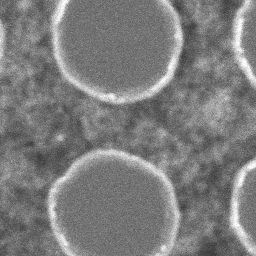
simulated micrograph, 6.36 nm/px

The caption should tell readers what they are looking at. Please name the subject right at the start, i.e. raised bodies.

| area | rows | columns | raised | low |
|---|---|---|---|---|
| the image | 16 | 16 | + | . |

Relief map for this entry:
....+++++++....+
...++++++++....+
....+++++++....+
....+++++++....+
....+++++++....+
.....+++++......
................
................
................
................
.....++++......+
....++++++.....+
...++++++++....+
...++++++++....+
....+++++++....+
....++++++......